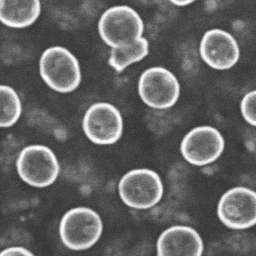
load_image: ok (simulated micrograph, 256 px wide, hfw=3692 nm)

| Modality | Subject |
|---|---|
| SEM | a regular array of raised bodies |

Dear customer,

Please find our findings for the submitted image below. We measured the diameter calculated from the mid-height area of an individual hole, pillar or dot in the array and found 561 nm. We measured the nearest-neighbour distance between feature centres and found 1.04 µm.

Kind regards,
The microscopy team